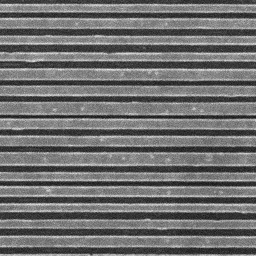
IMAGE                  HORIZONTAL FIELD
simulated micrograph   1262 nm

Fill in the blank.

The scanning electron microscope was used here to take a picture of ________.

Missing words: parallel lines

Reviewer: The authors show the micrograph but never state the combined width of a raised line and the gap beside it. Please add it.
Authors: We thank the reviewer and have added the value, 82.2 nm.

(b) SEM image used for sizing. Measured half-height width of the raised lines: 9.11 px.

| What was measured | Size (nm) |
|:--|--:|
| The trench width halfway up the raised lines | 35.7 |